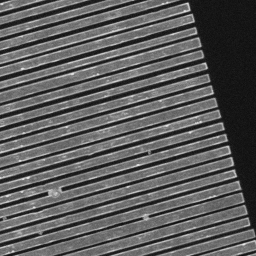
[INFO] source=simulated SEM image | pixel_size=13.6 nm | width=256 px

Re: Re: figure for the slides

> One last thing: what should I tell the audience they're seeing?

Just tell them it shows parallel lines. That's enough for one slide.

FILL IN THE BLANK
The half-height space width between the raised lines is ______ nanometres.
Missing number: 62.4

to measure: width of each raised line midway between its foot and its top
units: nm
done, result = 112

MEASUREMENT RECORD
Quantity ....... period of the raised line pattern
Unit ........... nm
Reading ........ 167